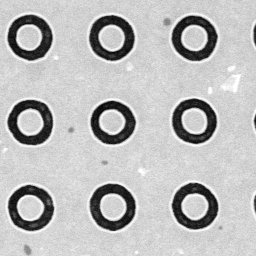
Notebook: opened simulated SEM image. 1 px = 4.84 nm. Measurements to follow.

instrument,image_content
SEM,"a regular array of ring-shaped grooves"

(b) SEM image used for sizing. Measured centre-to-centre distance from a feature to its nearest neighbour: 0.394 um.